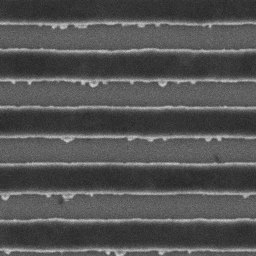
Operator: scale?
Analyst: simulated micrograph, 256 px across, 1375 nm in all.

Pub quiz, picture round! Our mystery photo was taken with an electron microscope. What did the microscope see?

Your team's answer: lines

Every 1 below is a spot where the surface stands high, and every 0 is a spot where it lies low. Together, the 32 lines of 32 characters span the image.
11111111111111111111111111111111
11111111111111111111111111111111
11111111111111111111111111111111
00000000000000000000000000000000
00000000000000000000000000000000
00000000000000000000000000000000
11111111111111111111111111111111
11111111111111111111111111111111
11111111111111111111111111111111
11111111111111111111111111111111
00000000000000000000000000000000
00000000000000000000000000000000
00000000000000000000000000000000
11111111111111111111111111111111
11111111111111111111111111111111
11111111111111111111111111111111
11111111111111111111111111111111
00000000000000000000000000000000
00000000000000000000000000000000
00000000000000000000000000000000
00011111111111111111111000101111
11111111111111111111111111111111
11111111111111111111111111111111
11111111111111111111111111111111
10000000000000000000000000000000
00000000000000000000000000000000
00000000000000000000000000000000
01011111111111111111111111111111
11111111111111111111111111111111
11111111111111111111111111111111
11111111111111111111111111111111
00000000000000100000000000000000